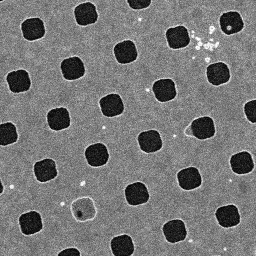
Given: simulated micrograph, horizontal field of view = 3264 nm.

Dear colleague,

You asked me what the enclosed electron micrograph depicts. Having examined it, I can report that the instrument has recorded a regular array of holes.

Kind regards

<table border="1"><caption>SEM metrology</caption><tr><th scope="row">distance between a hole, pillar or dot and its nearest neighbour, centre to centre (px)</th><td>53.2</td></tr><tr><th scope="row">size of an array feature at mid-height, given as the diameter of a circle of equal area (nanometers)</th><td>305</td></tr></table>